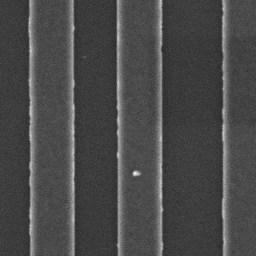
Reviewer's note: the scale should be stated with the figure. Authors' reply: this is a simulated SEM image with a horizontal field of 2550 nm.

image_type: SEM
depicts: lines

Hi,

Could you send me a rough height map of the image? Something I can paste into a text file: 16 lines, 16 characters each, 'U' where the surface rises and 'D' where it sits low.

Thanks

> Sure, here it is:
DDUUUDDUUUDDDDUU
DDUUUDDUUUDDDDUU
DDUUUDDUUUDDDDUU
DDUUUDDUUUDDDDUU
DDUUUDDUUUDDDDUU
DDUUUDDUUUDDDDUU
DDUUUDDUUUDDDDUU
DDUUUDDUUUDDDDUU
DDUUUDDUUUDDDDUU
DDUUUDDUUUDDDDUU
DDUUUDDUUUDDDDUU
DDUUUDDUUUDDDDUU
DDUUUDDUUUDDDDUU
DDUUUDDUUUDDDDUU
DDUUUDDUUUDDDDUU
DDUUUDDUUUDDDDUU